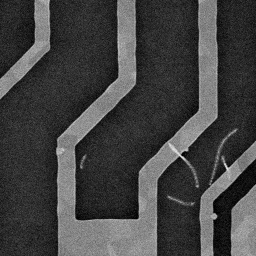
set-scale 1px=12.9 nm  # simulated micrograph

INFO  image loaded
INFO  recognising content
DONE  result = groups of lines, slits or small figures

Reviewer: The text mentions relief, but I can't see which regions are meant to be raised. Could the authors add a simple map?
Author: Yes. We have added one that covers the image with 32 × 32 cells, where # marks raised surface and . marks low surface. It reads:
....##.........##........##.....
....##.........##........##.....
....##.........##........##.....
....##.........##........##.....
....##.........##........##.....
....##.........##........##.....
...###.........##........##.....
..###..........##........##.....
.###...........##........##.....
###............##........##.....
##............###........##.....
#............###.........##.....
............###..........##.....
...........###...........##.....
..........###...........###.....
.........###...........###......
........###...........###.......
.......###...........###........
.......##...........###........#
.......##..........###........##
.......##.........###........##.
.......##........###........##..
.......##........###.......##...
.......##........###......##....
.......##........###.....##....#
.......##........###.....##...##
.......##........###.....##..###
.......###...##..###.....##..###
.......#############.....##..###
.......#############.....##..###
.......#############.....##..###
.......#############.....##..###